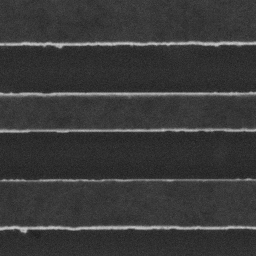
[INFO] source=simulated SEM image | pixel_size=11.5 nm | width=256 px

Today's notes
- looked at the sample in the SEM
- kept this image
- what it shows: lines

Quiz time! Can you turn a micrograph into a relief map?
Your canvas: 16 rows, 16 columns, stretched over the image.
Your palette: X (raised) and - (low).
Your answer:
XXXXXXXXXXXXXXXX
XXXXXXXXXXXXXXXX
XXXXXXXXXXXXXXXX
----------------
----------------
----------------
XXXXXXXXXXXXXXXX
XXXXXXXXXXXXXXXX
----------------
----------------
----------------
XXXXXXXXXXXXXXXX
XXXXXXXXXXXXXXXX
XXXXXXXXXXXXXXXX
----------------
----------------